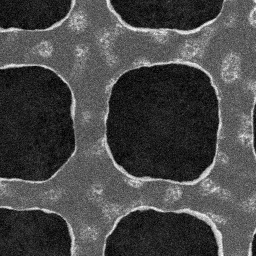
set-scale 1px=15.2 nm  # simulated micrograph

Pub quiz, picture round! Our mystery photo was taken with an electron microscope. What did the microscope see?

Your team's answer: holes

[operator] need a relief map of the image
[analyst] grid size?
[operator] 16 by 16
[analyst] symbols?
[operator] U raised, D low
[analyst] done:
DDDDUUUDDDDDDDUU
DDDDUUUUDDDDDUUU
UUUUUUUUUUUUUUUU
UUUUUUUUUUUUUUUU
DDDUUUUUDDDDDUUU
DDDDUUUDDDDDDUUU
DDDDDUUDDDDDDDUU
DDDDDUUDDDDDDDUU
DDDDDUUDDDDDDDUU
DDDDDUUDDDDDDUUU
DDDDUUUDDDDDDUUU
UUUUUUUUUUUUUUUU
UUUUUUUUUUUUUUUU
DDDDUUUUDDDDDUUU
DDDDUUUDDDDDDUUU
DDDDUUUDDDDDDDUU